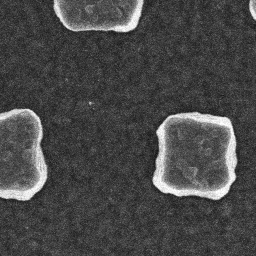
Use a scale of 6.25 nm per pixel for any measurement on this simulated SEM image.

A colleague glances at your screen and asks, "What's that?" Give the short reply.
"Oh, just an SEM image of raised bodies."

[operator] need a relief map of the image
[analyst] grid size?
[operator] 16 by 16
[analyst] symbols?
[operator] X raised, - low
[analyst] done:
----XXXXX-------
----XXXX--------
----------------
----------------
----------------
----------------
----------------
XX--------XXXX--
XXX-------XXXXX-
XX--------XXXXX-
XX--------XXXXX-
XX--------XXXX--
----------------
----------------
----------------
----------------